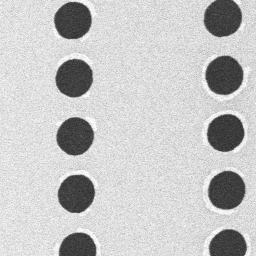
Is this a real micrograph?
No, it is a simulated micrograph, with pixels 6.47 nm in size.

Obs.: holes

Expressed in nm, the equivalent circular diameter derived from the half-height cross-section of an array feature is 244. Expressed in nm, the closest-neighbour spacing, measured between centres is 372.